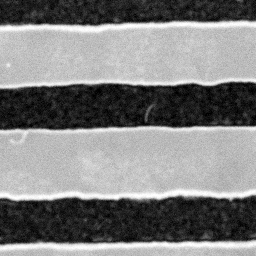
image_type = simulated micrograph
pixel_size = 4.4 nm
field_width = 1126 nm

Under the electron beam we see lines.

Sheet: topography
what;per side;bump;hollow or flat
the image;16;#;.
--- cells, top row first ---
................
........########
################
################
################
................
................
................
################
################
################
################
................
................
................
################